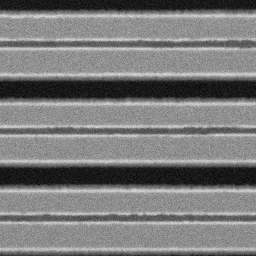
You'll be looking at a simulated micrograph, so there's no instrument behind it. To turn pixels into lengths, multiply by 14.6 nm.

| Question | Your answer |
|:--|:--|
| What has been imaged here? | lines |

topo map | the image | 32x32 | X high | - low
--------------------------------
--------------------------------
XXXXXXXXXXXXXXXXXXXXXXXXXXXXXXXX
XXXXXXXXXXXXXXXXXXXXXXXXXXXXXXXX
XXXXXXXXXXXXXXXXXXXXXXXXXXXXXXXX
XXXXXXXXXXXXXXXXXXXXXXXXXXXXXXXX
XXXXXXXXXXXXXXXXXXXXXXXXXXXXXXXX
XXXXXXXXXXXXXXXXXXXXXXXXXXXXXXXX
XXXXXXXXXXXXXXXXXXXXXXXXXXXXXXXX
XXXXXXXXXXXXXXXXXXXXXXXXXXXXXXXX
--------------------------------
--------------------------------
--------------------------------
XXXXXXXXXXXXXXXXXXXXXXXXXXXXXXXX
XXXXXXXXXXXXXXXXXXXXXXXXXXXXXXXX
XXXXXXXXXXXXXXXXXXXXXXXXXXXXXXXX
XXXXXXXXXXXXXXXXXXXXXXXXXXXXXXXX
XXXXXXXXXXXXXXXXXXXXXXXXXXXXXXXX
XXXXXXXXXXXXXXXXXXXXXXXXXXXXXXXX
XXXXXXXXXXXXXXXXXXXXXXXXXXXXXXXX
--------------------------------
--------------------------------
--------------------------------
--------------------------------
XXXXXXXXXXXXXXXXXXXXXXXXXXXXXXXX
XXXXXXXXXXXXXXXXXXXXXXXXXXXXXXXX
XXXXXXXXXXXXXXXXXXXXXXXXXXXXXXXX
XXXXXXXXXXXXXXXXXXXXXXXXXXXXXXXX
XXXXXXXXXXXXXXXXXXXXXXXXXXXXXXXX
XXXXXXXXXXXXXXXXXXXXXXXXXXXXXXXX
XXXXXXXXXXXXXXXXXXXXXXXXXXXXXXXX
--------------------------------